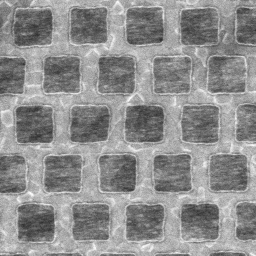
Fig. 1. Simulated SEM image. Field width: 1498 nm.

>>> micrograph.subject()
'a regular array of raised bodies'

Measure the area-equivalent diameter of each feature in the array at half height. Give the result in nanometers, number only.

251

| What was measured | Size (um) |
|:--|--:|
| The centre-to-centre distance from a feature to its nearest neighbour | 0.321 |